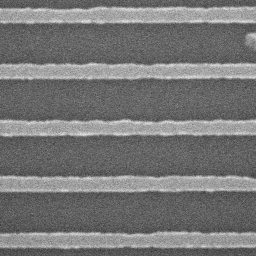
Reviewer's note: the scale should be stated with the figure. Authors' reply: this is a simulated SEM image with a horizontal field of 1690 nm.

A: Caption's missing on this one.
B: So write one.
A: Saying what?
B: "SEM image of lines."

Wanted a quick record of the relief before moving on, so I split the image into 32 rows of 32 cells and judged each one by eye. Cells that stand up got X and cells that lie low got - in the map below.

--------------------------------
XXXXXXXXXXXXXXXXXXXXXXXXXXXXXXXX
XXXXXXXXXXXXXXXXXXXXXXXXXXXXXXXX
--------------------------------
-------------------------------X
-------------------------------X
--------------------------------
--------------------------------
XXXXXXXXXXXXXXXXXXXXXXXXXXXXXXXX
XXXXXXXXXXXXXXXXXXXXXXXXXXXXXXXX
--------------------------------
--------------------------------
--------------------------------
--------------------------------
--------------------------------
XXXXXXXXXXXXXXXXXXXXXXXXXXXXXXXX
XXXXXXXXXXXXXXXXXXXXXXXXXXXXXXXX
--------------------------------
--------------------------------
--------------------------------
--------------------------------
--------------------------------
XXXXXXXXXXXXXXXXXXXXXXXXXXXXXXXX
XXXXXXXXXXXXXXXXXXXXXXXXXXXXXXXX
--------------------------------
--------------------------------
--------------------------------
--------------------------------
--------------------------------
XXXXXXXXXXXXXXXXXXXXXXXXXXXXXXXX
XXXXXXXXXXXXXXXXXXXXXXXXXXXXXXXX
--------------------------------